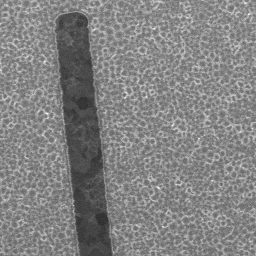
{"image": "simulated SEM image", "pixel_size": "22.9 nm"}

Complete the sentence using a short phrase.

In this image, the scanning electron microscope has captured one or a few lines or trenches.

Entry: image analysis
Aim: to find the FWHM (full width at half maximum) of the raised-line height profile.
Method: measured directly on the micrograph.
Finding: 793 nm